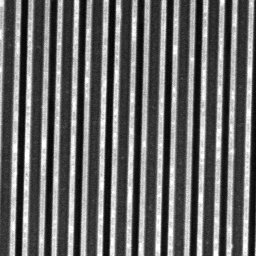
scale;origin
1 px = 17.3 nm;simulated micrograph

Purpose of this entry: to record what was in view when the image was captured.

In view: parallel lines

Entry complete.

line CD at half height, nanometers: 104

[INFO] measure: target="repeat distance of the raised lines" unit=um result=0.252